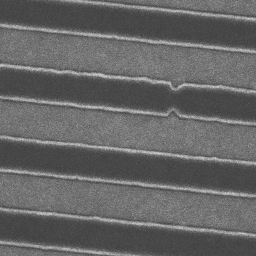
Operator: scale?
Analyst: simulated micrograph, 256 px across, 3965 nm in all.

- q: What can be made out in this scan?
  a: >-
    one or a few lines or trenches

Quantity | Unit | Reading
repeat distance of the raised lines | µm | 1.11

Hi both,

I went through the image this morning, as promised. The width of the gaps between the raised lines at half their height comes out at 0.589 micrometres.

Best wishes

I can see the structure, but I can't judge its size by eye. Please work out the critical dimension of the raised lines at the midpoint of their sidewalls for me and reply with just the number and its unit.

514 nanometres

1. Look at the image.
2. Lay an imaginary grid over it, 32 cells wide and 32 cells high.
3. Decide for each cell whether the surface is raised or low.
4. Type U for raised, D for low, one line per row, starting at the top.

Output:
UUUUUUUUUUUUUUDDDDDDDDDDDDDDDDDD
UUUUUUUUUUUUUUUUUUUUUUUUDDDDDDDD
UUUUUUUUUUUUUUUUUUUUUUUUUUUUUUUU
DDDUUUUUUUUUUUUUUUUUUUUUUUUUUUUU
DDDDDDDDDDDDDUUUUUUUUUUUUUUUUUUU
DDDDDDDDDDDDDDDDDDDDDUUUUUUUUUUU
DDDDDDDDDDDDDDDDDDDDDDDDDDDDDDDD
DDDDDDDDDDDDDDDDDDDDDDDDDDDDDDDD
UUUUDDDDDDDDDDDDDDDDDDDDDDDDDDDD
UUUUUUUUUUUUUDDDDDDDDDDDDDDDDDDD
UUUUUUUUUUUUUUUUUUUUUDDDDDDDDDDD
UUUUUUUUUUUUUUUUUUUUUUUUUUUUUUUU
DDDUUUUUUUUUUUUUUUUUUUUUUUUUUUUU
DDDDDDDDDDDDDUUUUUUUUUUUUUUUUUUU
DDDDDDDDDDDDDDDDDDDDDDDUUUUUUUUU
DDDDDDDDDDDDDDDDDDDDDDDDDDDDDDDU
DDDDDDDDDDDDDDDDDDDDDDDDDDDDDDDD
UUUDDDDDDDDDDDDDDDDDDDDDDDDDDDDD
UUUUUUUUUUUUUUDDDDDDDDDDDDDDDDDD
UUUUUUUUUUUUUUUUUUUUUUUDDDDDDDDD
UUUUUUUUUUUUUUUUUUUUUUUUUUUUUUUU
DDUUUUUUUUUUUUUUUUUUUUUUUUUUUUUU
DDDDDDDDDDDDUUUUUUUUUUUUUUUUUUUU
DDDDDDDDDDDDDDDDDDDDDDUUUUUUUUUU
DDDDDDDDDDDDDDDDDDDDDDDDDDDDDDDU
DDDDDDDDDDDDDDDDDDDDDDDDDDDDDDDD
UUUUDDDDDDDDDDDDDDDDDDDDDDDDDDDD
UUUUUUUUUUUUUUDDDDDDDDDDDDDDDDDD
UUUUUUUUUUUUUUUUUUUUUUUDDDDDDDDD
UUUUUUUUUUUUUUUUUUUUUUUUUUUUUUUU
DDUUUUUUUUUUUUUUUUUUUUUUUUUUUUUU
DDDDDDDDDDDUUUUUUUUUUUUUUUUUUUUU